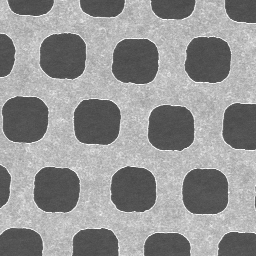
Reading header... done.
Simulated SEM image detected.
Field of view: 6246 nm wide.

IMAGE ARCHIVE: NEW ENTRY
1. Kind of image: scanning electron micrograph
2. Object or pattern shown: a regular array of holes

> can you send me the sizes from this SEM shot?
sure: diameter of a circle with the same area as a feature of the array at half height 1190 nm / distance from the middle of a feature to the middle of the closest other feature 1750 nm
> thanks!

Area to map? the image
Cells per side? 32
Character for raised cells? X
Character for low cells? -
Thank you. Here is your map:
X------XXX------XXX-----XXXX----
XX----XXXX-----XXXX-----XXXX----
XXXXXXXXXXXXXXXXXXXXXXXXXXXXX---
XXXXXXXXXXXXXXXXXXXXXXXXXXXXXXXX
-XXXXX----XXXXXXXXXXXXXXXXXXXXXX
--XXX------XXXX----XXXXX----XXXX
--XXX------XXX------XXX------XXX
--XXX------XXX------XXX------XXX
--XXX------XXX------XXX------XXX
-XXXXX----XXXX-----XXXXX----XXXX
XXXXXXXXXXXXXXXXX-XXXXXXXXXXXXXX
XXXXXXXXXXXXXXXXXXXXXXXXXXXXXXXX
X----XXXXXX---XXXXXXXXXXXXXXXXXX
------XXX------XXXX----XXXXX----
------XXX------XXXX-----XXXX----
------XXX------XXXX-----XXXX----
------XXX------XXX------XXXX----
X----XXXXX----XXXXX-----XXXX----
XXXXXXXXXXXXXXXXXXX----XXXXXX---
XXXXXXXXXXXXXXXXXXXXXXXXXXXXXXXX
XXXXXXXXXXXXXXXXXXXXXXXXXXXXXXXX
-XXXX----XXXXXX----XXXXX----XXXX
-XXX------XXXX-----XXXX-----XXXX
-XXX------XXXX------XXX------XXX
-XXX------XXXX------XXX------XXX
-XXXX-----XXXX-----XXXX-----XXXX
XXXXXX---XXXXXXX--XXXXXX----XXXX
XXXXXXXXXXXXXXXXXXXXXXXXXXXXXXXX
XX-XXXXXXXXXXXXXXXXXXXXXXXXXXXXX
-----XXXX------XXXX----XXXXX----
-----XXXX------XXX------XXX-----
-----XXXX------XXX------XXX-----